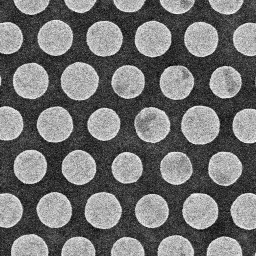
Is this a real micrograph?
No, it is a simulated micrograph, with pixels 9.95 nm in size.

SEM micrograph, a regular array of raised bodies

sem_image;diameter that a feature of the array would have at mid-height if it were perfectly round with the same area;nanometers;343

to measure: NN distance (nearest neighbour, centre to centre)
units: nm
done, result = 482